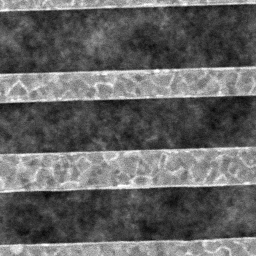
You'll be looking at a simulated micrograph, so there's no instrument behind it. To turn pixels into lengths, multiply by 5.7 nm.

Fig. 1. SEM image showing one or a few lines or trenches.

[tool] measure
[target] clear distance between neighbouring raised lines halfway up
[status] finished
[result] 306 nm